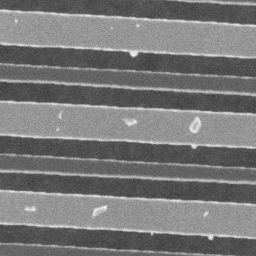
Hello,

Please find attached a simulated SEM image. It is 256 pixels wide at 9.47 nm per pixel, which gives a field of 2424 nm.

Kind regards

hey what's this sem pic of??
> lines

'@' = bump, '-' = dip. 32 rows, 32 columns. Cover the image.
--------------------------------
@@@-----------------------------
@@@@@@@@@@@@@@@@@@@@@-----------
@@@@@@@@@@@@@@@@@@@@@@@@@@@@@@@@
@@@@@@@@@@@@@@@@@@@@@@@@@@@@@@@@
@@@@@@@@@@@@@@@@@@@@@@@@@@@@@@@@
----------------@@@@@@@@@@@@@@@@
--------------------------------
@@@@@@@@------------------------
@@@@@@@@@@@@@@@@@@@@@@@@@@@@----
----------@@@@@@@@@@@@@@@@@@@@@@
-------------------------@@@@@@@
--------------------------------
@@@@@@@@@@@@@@@-----------------
@@@@@@@@@@@@@@@@@@@@@@@@@@@@@@@@
@@@@@@@@@@@@@@@@@@@@@@@@@@@@@@@@
@@@@@@@@@@@@@@@@@@@@@@@@@@@@@@@@
------------@@@@@@@@@@@@@@@@@@@@
--------------------------------
@@@@----------------------------
@@@@@@@@@@@@@@@@@@@@@@@---------
---@@@@@@@@@@@@@@@@@@@@@@@@@@@@@
-------------------------@@@@@@@
--------------------------------
@@@@@@@@@@@@@-------------------
@@@@@@@@@@@@@@@@@@@@@@@@@@@@@@@@
@@@@@@@@@@@@@@@@@@@@@@@@@@@@@@@@
@@@@@@@@@@@@@@@@@@@@@@@@@@@@@@@@
---------@@@@@@@@@@@@@@@@@@@@@@@
--------------------------@@@@@@
@@@-----------------------------
@@@@@@@@@@@@@@@@@@@-------------